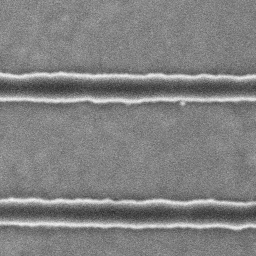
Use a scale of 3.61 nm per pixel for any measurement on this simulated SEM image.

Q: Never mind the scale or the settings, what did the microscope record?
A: lines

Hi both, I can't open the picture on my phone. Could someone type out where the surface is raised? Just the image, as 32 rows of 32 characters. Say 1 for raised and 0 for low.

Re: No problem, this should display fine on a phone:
00000000000000000000000000000000
00000000000000000000000000000000
00000000000000000000000000000000
00000000000000000000000000000000
00000000000000000000000000000000
00000000000000000000000000000000
00000000000000000000000000000000
00000000000000000000000000000000
00000000000000000000000000000000
11111111111111111011111011111001
11111111111111111111111111111111
11111111111111111111111111111111
11111111111111111111111111111101
00000000000000000000000000000000
00000000000000000000000000000000
00000000000000000000000000000000
00000000000000000000000000000000
00000000000000000000000000000000
00000000000000000000000000000000
00000000000000000000000000000000
00000000000000000000000000000000
00000000000000000000000000000000
00000000000000000000000000000000
00000000000000000000000000000000
00000000000000000000000000000000
11111111111111111111111111111111
11111111111111111111111111111111
11111111111111111111111111111111
00000000000000000000000000000110
00000000000000000000000000000000
00000000000000000000000000000000
00000000000000000000000000000000